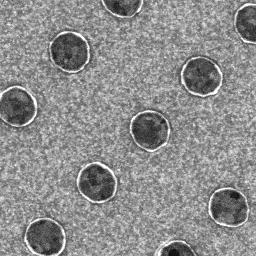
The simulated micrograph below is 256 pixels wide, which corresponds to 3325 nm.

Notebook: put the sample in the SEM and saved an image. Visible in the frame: raised bodies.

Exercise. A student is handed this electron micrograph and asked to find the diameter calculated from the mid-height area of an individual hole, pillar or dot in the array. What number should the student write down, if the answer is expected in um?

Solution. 0.509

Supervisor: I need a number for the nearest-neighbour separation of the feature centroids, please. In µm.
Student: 0.97